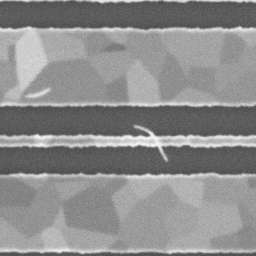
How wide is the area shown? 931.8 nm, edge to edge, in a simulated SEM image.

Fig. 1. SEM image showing lines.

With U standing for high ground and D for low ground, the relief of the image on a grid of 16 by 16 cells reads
DDDDDDDDDDDDDDDD
DDDDDDDDDDDDDDDD
UUUUUUUUUUUUUUUU
UUUUUUUUUUUUUUUU
UUUUUUUUUUUUUUUU
UUUUUUUUUUUUUUUU
UUUUUUUUUUUUUUUU
DDDDDDDDDDDDDDDD
DDDDDDDDDUDDDDDD
DDDDDDDDDDDDDDDD
DDDDDDDDDDDDDDDD
UUUUUUUUUUUUUUUU
UUUUUUUUUUUUUUUU
UUUUUUUUUUUUUUUU
UUUUUUUUUUUUUUUU
UUUUUUUUUUUUUUUU